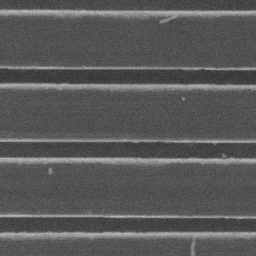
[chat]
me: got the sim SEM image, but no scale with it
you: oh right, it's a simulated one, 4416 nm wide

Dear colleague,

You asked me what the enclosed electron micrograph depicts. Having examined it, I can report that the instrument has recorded lines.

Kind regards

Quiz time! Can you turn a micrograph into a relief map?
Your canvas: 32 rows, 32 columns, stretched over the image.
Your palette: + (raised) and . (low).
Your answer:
................................
................................
++++++++++++++++++++++++++++++++
++++++++++++++++++++++++++++++++
++++++++++++++++++++++++++++++++
++++++++++++++++++++++++++++++++
++++++++++++++++++++++++++++++++
++++++++++++++++++++++++++++++++
..++++++++++++++++++++++++++++++
................................
................................
++++++++++++++++++++++++++++++++
++++++++++++++++++++++++++++++++
++++++++++++++++++++++++++++++++
++++++++++++++++++++++++++++++++
++++++++++++++++++++++++++++++++
++++++++++++++++++++++++++++++++
++++++++++++++++++++++++++++++++
................................
................................
++++++++++++++++++++++++++++++++
++++++++++++++++++++++++++++++++
++++++++++++++++++++++++++++++++
++++++++++++++++++++++++++++++++
++++++++++++++++++++++++++++++++
++++++++++++++++++++++++++++++++
++++++++++++++++++++++++++++++++
................................
................................
++++++++++++++++++++++++++++++++
++++++++++++++++++++++++++++++++
++++++++++++++++++++++++++++++++